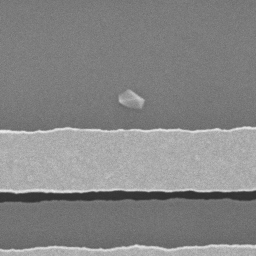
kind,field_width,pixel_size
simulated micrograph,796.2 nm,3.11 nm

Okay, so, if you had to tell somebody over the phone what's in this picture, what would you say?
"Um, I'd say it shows lines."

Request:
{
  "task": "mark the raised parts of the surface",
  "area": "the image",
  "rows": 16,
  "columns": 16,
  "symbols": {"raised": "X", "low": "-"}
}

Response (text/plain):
----------------
----------------
----------------
----------------
----------------
----------------
----------------
----------------
XXXXXXXXXXXXXXXX
XXXXXXXXXXXXXXXX
XXXXXXXXXXXXXXXX
XXXXXXXXXXXXXXXX
----------------
----------------
----------------
--XXX--XXX-XXXXX